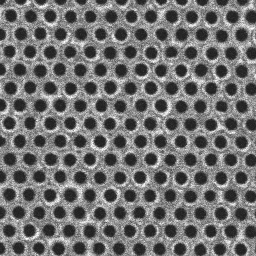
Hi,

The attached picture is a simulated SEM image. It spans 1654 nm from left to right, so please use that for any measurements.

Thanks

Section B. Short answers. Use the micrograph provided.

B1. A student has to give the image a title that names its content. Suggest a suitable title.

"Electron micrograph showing a regular array of holes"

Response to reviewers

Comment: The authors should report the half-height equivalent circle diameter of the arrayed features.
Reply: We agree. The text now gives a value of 82.2 nm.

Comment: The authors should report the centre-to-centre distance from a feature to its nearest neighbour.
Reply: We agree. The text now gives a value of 127 nm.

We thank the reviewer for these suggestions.